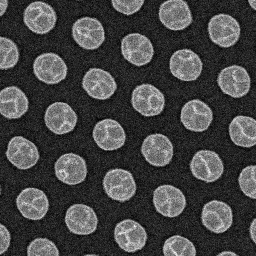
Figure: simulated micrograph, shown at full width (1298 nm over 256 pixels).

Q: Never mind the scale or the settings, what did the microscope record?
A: a regular array of raised bodies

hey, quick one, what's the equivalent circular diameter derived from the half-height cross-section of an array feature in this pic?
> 31.5 pixels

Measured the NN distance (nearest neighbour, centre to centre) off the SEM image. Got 259 nm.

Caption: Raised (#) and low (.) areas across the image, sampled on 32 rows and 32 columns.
#...##........####..###........#
...####........##...####........
...####...##........####..###...
....##...####........##...####..
.........####...##........####..
##........###..####........##...
##.............####...##........
##...###........###..####.......
#...####.............####...##..
.....###...###........###..####.
..........####.............####.
###........###...###........###.
###..............###............
###...###........###...###......
.##...###..............###......
......###...###........###...###
.......#....####.............###
.##.........####..###........###
.####........##...####..........
.####...##........####..###.....
..##...####........##...####....
.......####...##........####..##
........##...####........##...##
.............####...##........##
..####........##...####........#
..####.............####...##....
...###..####........###..####...
........####.............####...
#........###...###........##...#
#.............####.............#
#...###........###...###........
...####.............####....#...